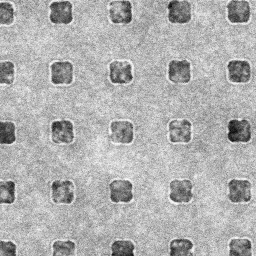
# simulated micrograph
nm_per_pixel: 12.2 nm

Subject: a regular array of holes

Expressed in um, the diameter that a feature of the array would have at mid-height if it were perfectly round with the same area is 0.316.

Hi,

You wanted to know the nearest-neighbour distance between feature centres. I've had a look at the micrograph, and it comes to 720 nm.